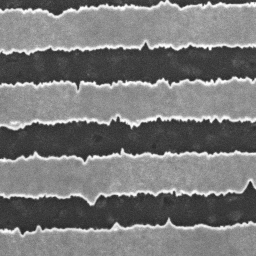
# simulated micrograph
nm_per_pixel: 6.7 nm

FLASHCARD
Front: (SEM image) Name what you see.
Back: one or a few lines or trenches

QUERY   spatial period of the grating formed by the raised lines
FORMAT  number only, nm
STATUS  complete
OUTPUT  493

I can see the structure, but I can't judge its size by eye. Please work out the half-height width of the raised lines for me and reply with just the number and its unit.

40.1 px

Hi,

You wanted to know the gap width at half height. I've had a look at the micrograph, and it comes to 228 nm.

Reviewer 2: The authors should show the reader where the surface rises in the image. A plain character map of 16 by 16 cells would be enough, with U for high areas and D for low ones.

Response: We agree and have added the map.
DDDDDUUUUUUUUUUU
UUUUUUUUUUUUUUUU
UUUUUUUUUUUUUUUU
DDDDDDDDDDDDDDDD
DDDDDDDDDDDDDDDD
UUUUUUUUUUUUUUUU
UUUUUUUUUUUUUUUU
UUUUUUUDUDDDDDDU
DDDDDDDDDDDDDDDD
DDDDDDDDDDDDDDDD
UUUUUUUUUUUUUUUU
UUUUUUUUUUUUUUUU
DDDDDUDDDDDDDDDD
DDDDDDDDDDDDDDDD
UDUUUUUUUUUUUUUU
UUUUUUUUUUUUUUUU